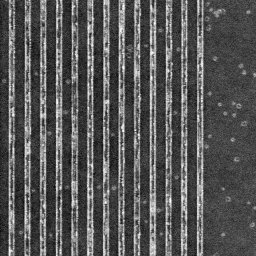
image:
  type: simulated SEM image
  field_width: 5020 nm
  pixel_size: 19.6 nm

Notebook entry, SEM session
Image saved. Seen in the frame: parallel lines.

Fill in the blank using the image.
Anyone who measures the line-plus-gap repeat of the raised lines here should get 307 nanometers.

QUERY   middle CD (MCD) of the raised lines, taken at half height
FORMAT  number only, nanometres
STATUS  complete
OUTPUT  85.8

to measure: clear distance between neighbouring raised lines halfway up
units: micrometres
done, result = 0.213